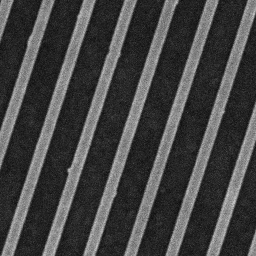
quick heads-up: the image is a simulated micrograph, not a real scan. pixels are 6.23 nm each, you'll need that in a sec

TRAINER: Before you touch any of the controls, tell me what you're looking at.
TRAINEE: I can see parallel lines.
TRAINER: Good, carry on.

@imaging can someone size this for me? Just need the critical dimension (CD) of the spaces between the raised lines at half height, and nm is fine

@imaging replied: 177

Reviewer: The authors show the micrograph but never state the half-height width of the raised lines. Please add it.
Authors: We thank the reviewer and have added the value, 10.5 pixels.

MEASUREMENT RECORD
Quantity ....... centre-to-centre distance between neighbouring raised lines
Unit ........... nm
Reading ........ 244